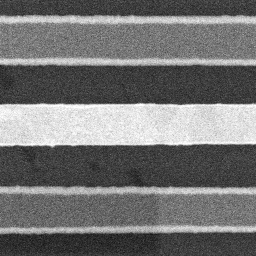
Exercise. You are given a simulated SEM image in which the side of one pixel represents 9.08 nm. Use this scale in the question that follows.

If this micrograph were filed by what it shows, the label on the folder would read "lines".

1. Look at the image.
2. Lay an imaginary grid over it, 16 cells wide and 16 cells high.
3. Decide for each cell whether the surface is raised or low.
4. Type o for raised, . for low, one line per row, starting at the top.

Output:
................
oooooooooooooooo
oooooooooooooooo
oooooooooooooooo
................
................
................
oooooooooooooooo
oooooooooooooooo
................
................
................
oooooooooooooooo
oooooooooooooooo
oooo.o..........
................